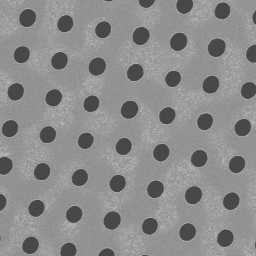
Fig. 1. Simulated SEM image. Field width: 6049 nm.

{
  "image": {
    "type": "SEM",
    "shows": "a regular array of holes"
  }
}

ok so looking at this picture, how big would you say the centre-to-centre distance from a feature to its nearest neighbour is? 880 nm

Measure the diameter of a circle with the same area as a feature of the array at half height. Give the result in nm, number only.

400